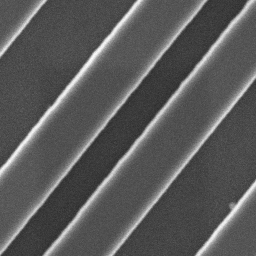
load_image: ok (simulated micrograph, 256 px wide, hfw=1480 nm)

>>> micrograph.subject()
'lines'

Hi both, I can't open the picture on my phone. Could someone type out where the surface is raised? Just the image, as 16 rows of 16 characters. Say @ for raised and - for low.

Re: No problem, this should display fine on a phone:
@@------@@@@@--@
@@-----@@@@@--@@
@------@@@@---@@
------@@@@---@@@
-----@@@@---@@@@
----@@@@---@@@@-
---@@@@@--@@@@@-
---@@@@---@@@@--
--@@@@---@@@@---
-@@@@---@@@@----
@@@@---@@@@-----
@@@@--@@@@@-----
@@@---@@@@-----@
@@---@@@@-----@@
@---@@@@-----@@@
---@@@@------@@@